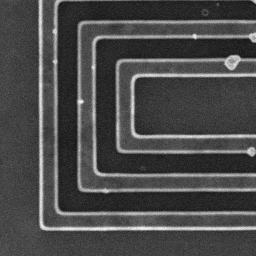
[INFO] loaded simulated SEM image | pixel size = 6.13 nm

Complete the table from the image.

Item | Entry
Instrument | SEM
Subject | groups of lines, slits or small figures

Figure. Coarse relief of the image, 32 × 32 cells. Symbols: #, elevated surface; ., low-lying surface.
.....##.........................
.....##.........................
.....##.........................
.....##...######################
.....##...######################
.....##...##....................
.....##...##....................
.....##...##............########
.....##...##...#################
.....##...##...###..............
.....##...##...##...............
.....##...##...##...............
.....##...##...##...............
.....##...##...##...............
.....##...##...##...............
.....##...##...##...............
.....##...##...##...............
.....##...##...#################
.....##...##...#################
.....##...##....................
.....##...##....................
.....##...##....................
.....##...######################
.....##...######################
.....##.........................
.....##.........................
.....###........................
.....###########################
......########################..
................................
................................
................................